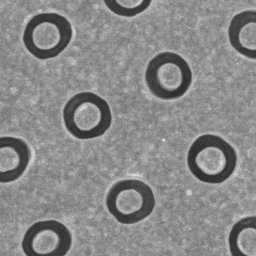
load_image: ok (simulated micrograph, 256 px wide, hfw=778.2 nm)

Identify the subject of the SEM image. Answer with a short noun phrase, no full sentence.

ring-shaped grooves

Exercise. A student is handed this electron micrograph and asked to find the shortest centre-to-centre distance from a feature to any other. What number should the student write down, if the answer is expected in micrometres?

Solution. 0.273